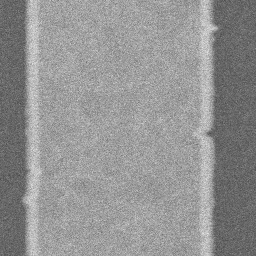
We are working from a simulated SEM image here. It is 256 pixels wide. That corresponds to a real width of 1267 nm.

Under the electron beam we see one or a few lines or trenches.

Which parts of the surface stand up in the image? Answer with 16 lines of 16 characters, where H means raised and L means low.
LLHHHHHHHHHHHLLL
LLHHHHHHHHHHHLLL
LLHHHHHHHHHHHLLL
LLHHHHHHHHHHHLLL
LLHHHHHHHHHHHLLL
LLHHHHHHHHHHHLLL
LLHHHHHHHHHHHLLL
LLHHHHHHHHHHHLLL
LLHHHHHHHHHHHLLL
LLHHHHHHHHHHHLLL
LLHHHHHHHHHHHLLL
LLHHHHHHHHHHHLLL
LLHHHHHHHHHHHLLL
LLHHHHHHHHHHHLLL
LLHHHHHHHHHHHLLL
LLHHHHHHHHHHHLLL